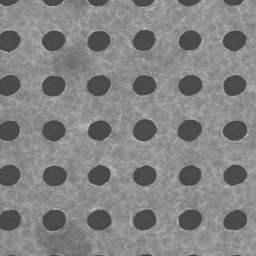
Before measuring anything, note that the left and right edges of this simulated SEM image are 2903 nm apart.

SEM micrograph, a regular array of holes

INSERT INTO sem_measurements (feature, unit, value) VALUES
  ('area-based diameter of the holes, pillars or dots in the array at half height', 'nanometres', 248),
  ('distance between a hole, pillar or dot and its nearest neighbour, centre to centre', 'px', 44.5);